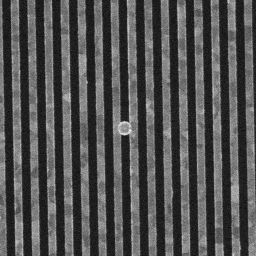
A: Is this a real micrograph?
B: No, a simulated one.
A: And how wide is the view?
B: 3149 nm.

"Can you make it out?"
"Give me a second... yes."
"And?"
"parallel lines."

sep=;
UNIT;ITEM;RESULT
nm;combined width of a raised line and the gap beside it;205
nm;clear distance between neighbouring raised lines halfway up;114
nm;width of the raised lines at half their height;90.7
